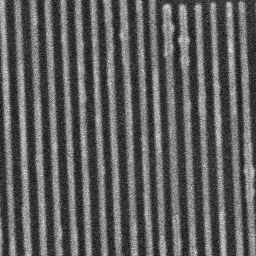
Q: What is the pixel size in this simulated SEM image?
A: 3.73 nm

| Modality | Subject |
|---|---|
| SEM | parallel lines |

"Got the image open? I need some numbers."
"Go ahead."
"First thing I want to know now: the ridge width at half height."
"5.5 pixels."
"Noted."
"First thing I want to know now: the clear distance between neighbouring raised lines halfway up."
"9.12 pixels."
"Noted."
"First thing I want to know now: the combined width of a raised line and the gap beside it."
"55.8 nanometres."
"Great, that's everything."